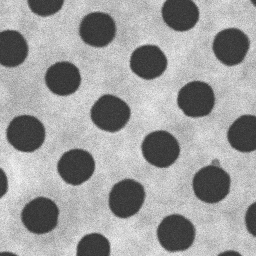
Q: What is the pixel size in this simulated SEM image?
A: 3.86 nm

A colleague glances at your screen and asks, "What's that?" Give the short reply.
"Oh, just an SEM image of a regular array of holes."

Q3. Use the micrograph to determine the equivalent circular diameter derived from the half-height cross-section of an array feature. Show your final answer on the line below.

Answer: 142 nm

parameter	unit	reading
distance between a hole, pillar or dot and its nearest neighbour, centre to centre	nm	233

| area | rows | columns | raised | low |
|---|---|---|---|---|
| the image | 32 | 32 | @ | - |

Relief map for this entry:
@@@@----@@@@@@@@@@@@----@@@@@@@@
@@@@---@@@@@@@@@@@@@-----@@@@@@@
@@@@@@@@@@----@@@@@@-----@@@@@@@
@@@@@@@@@@----@@@@@@@---@@@@@@@@
---@@@@@@@----@@@@@@@@@@@@@----@
---@@@@@@@@--@@@@@@@@@@@@@@----@
---@@@@@@@@@@@@@@---@@@@@@@----@
---@@@@@@@@@@@@@-----@@@@@@---@@
@@@@@@----@@@@@@-----@@@@@@@@@@@
@@@@@@----@@@@@@@---@@@@@@@@@@@@
@@@@@@----@@@@@@@@@@@@@---@@@@@@
@@@@@@@--@@@@@@@@@@@@@-----@@@@@
@@@@@@@@@@@@---@@@@@@@-----@@@@@
@@@@@@@@@@@-----@@@@@@@----@@@@@
@@--@@@@@@@-----@@@@@@@@--@@@@--
@----@@@@@@@----@@@@@@@@@@@@@---
@-----@@@@@@@@@@@@@--@@@@@@@----
@-----@@@@@@@@@@@@----@@@@@@@---
@@---@@@@@@@@@@@@@----@@@@@@@---
@@@@@@@@---@@@@@@@----@@@@@@@@@@
@@@@@@@-----@@@@@@@--@@@@@@@@@@@
@@@@@@@-----@@@@@@@@@@@@@---@@@@
-@@@@@@@---@@@@@@@@@@@@@-----@@@
-@@@@@@@@@@@@@----@@@@@@-----@@@
@@@@@@@@@@@@@@----@@@@@@@---@@@@
@@@----@@@@@@@----@@@@@@@@@@@@@@
@@@----@@@@@@@---@@@@@@@@@@@@@@-
@@@----@@@@@@@@@@@@@---@@@@@@@@-
@@@----@@@@@@@@@@@@@----@@@@@@@-
@@@@@@@@@@@--@@@@@@@----@@@@@@@@
@@@@@@@@@@----@@@@@@----@@@@@@@@
-@@@@@@@@@----@@@@@@@@@@@@@@--@@